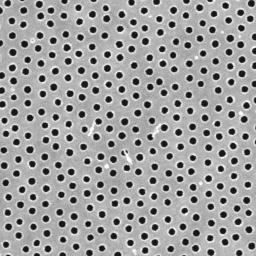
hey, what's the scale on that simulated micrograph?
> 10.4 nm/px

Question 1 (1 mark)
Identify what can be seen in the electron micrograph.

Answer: a regular array of holes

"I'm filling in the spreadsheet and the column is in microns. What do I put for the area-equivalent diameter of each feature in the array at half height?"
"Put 0.0722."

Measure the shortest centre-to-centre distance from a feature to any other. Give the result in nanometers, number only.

140